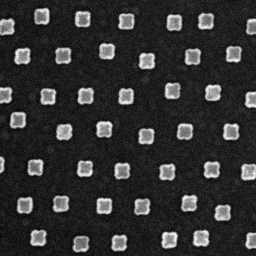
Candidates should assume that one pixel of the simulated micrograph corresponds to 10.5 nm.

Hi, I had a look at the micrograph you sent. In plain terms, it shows a regular array of raised bodies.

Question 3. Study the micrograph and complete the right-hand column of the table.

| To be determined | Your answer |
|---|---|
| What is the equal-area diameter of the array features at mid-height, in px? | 15.7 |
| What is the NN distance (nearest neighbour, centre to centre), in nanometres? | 402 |